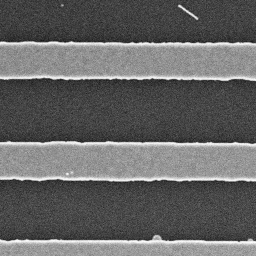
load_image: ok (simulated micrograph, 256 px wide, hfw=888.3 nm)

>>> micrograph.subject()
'lines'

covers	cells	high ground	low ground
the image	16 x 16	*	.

................
................
................
****************
****************
................
................
................
................
****************
****************
................
................
................
................
****************